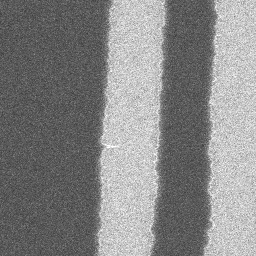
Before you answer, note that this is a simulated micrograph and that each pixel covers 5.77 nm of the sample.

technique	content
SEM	one or a few lines or trenches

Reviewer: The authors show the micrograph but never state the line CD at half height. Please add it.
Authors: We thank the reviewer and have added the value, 320 nm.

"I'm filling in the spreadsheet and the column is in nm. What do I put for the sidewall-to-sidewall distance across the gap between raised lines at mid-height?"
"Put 297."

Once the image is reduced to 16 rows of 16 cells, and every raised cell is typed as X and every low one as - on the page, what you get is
XXXXXXX---XXXX--
XXXXXXX---XXXX--
XXXXXXX---XXXX--
XXXXXXX---XXXX--
XXXXXXX---XXX---
XXXXXXX---XXX---
XXXXXXX---XXX---
XXXXXXX---XXX---
XXXXXX----XXX---
XXXXXXX---XXX---
XXXXXX----XXX---
XXXXXX----XXX---
XXXXXX----XXX---
XXXXXX----XXX---
XXXXXX---XXXX---
XXXXXX---XXXX---